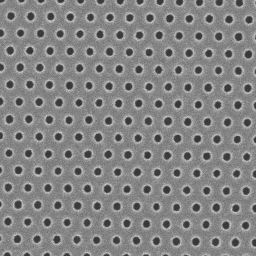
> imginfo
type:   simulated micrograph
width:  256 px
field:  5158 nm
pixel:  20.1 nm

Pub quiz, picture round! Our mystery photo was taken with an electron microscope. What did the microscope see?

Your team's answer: a regular array of holes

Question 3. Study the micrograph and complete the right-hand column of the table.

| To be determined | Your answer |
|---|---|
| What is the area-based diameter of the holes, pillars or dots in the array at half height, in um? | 0.161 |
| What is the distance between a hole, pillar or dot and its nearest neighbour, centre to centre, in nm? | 392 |